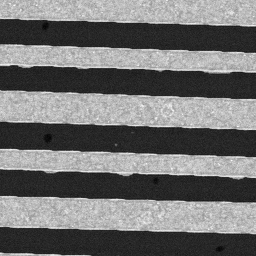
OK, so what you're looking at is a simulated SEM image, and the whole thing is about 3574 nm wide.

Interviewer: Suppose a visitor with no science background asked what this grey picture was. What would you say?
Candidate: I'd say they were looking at lines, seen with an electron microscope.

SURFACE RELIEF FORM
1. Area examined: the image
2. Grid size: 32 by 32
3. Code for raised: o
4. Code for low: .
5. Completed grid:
oooooooooooooooooooooooooooooooo
oooooooooooooooooooooooooooooooo
.......ooooooooooooooooooooooooo
................................
................................
................................
oooooooooooooooooooooooooooo....
oooooooooooooooooooooooooooooooo
..............oooooooooooooooooo
................................
................................
oooo............................
oooooooooooooooooooooooooooooooo
oooooooooooooooooooooooooooooooo
oooooooooooooooooooooooooooooooo
............oooooooooooooooooooo
................................
................................
................................
oooooooooooooooooooooooo........
oooooooooooooooooooooooooooooooo
..............oooooooooooooooooo
................................
................................
................................
oooooooooooooooooooooooooooooooo
oooooooooooooooooooooooooooooooo
oooooooooooooooooooooooooooooooo
......oooooooooooooooooooooooooo
................................
................................
................................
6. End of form